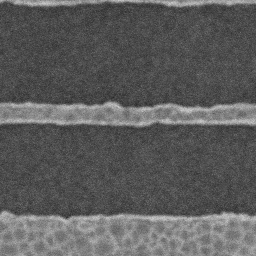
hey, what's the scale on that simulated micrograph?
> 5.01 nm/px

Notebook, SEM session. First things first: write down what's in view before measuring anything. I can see one or a few lines or trenches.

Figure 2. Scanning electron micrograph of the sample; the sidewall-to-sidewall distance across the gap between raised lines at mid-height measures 486 nanometers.